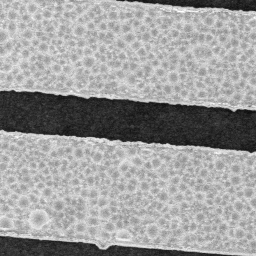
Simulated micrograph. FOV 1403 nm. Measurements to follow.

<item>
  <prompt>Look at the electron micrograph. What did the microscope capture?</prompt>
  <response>one or a few lines or trenches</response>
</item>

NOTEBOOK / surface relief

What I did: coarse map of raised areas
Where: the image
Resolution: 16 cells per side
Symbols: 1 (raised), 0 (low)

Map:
1111111111110000
1111111111111111
1111111111111111
1111111111111111
1111111111111111
1111111111111111
0000000000001111
0000000000000000
1111000000000000
1111111111111110
1111111111111111
1111111111111111
1111111111111111
1111111111111111
1111111111111111
0000000000111111